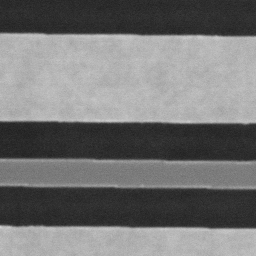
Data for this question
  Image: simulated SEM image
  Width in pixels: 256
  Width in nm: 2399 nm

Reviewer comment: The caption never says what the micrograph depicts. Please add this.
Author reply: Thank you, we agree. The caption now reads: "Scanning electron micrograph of lines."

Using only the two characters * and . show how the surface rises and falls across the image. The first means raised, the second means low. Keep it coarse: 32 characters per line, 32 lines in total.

................................
................................
................................
................................
******************..............
********************************
********************************
********************************
********************************
********************************
********************************
********************************
********************************
********************************
********************************
................................
................................
................................
................................
................................
********************************
********************************
********************************
...........................*****
................................
................................
................................
................................
****************................
********************************
********************************
********************************